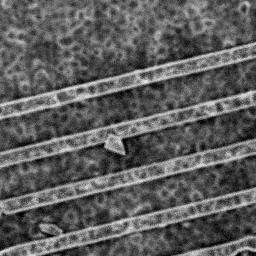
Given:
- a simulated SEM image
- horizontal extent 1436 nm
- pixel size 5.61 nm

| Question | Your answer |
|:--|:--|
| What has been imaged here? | parallel lines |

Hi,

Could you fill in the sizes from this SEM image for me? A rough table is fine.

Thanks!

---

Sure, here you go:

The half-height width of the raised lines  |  0.0763 microns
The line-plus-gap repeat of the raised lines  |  47 px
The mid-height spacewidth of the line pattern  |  0.191 um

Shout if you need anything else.